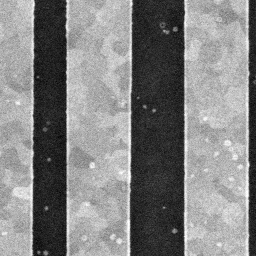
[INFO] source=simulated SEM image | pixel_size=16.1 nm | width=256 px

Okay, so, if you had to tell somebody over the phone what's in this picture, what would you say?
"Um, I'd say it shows lines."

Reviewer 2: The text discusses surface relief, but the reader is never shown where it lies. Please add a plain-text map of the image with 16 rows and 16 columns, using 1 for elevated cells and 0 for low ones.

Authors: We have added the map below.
1100111100001110
1100111100001110
1100111100001110
1100111100001110
1100111100001110
1100111100001110
1100111100001110
1100111100001110
1100111100001110
1100111100001110
1100111100001111
1100111100001110
1100111100001110
1100111100001110
1100111100001110
1100111100001110